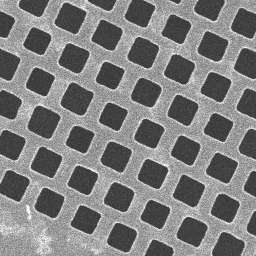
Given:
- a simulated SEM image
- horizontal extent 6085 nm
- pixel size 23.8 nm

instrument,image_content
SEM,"a regular array of holes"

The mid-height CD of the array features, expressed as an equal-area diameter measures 670 nanometers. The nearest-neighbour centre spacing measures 953 nm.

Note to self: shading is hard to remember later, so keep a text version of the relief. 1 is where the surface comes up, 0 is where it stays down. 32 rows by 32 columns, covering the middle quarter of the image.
00000111100001111110001111000000
10000111100000011111111110000000
11111111000000011111111110000000
11111111000000011110111111000000
11111111000000111100001111110001
10001111110000111100000011111111
00000011111101111000000011111111
00000001111111111000000011111111
00000001111111111000000011110001
00000001111111111100000111100000
00000011110000111111001111100000
10000011110000001111111111000000
11100111100000001111111111000000
11111111100000011111111111100000
11111111100000011110000111111000
11101111110000111110000001111111
11000011111100111100000001111111
10000000111111111100000001111111
10000001111111111100000011110001
00000001111001111100000011110000
10000001111000011111000111100000
11100011110000000111111111100000
11111111110000000111111111100000
11111111100000000111111111110000
11111111100000001111000111111000
11101111110000001110000001111111
11000001111100011110000000111111
11000000111111111110000000111111
10000000111111111100000001111000
10000000111111111110000001111000
10000000111100011111100011110000
11100001111000000111111111110000